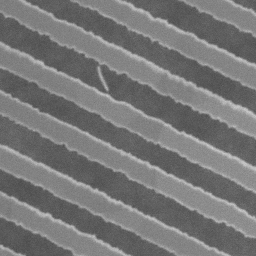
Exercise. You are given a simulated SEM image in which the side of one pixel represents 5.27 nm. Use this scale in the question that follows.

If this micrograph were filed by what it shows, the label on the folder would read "lines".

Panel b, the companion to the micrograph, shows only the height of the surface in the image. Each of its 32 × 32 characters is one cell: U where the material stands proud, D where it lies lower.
UUUUDDDDDDUUUUUUDDDDDDDUUUUUUUDD
UUUUUUDDDDDDUUUUUUDDDDDDDUUUUUUU
DDUUUUUUDDDDDDUUUUUUDDDDDDDUUUUU
DDDDUUUUUUDDDDDDUUUUUUDDDDDDDDUU
DDDDDDUUUUUUDDDDDDUUUUUUDDDDDDDD
DDDDDDDUUUUUUUDDDDDDUUUUUUDDDDDD
UUUDDDDDDDUUUUUUDDDDDDUUUUUUDDDD
UUUUDDDDDDDDUUUUUUDDDDDDUUUUUUDD
UUUUUUDDDDDDDDUUUUUUDDDDDDUUUUUU
DDUUUUUUUDDDDDDDUUUUUUDDDDDDUUUU
DDDDDUUUUUUDDDDDDDUUUUUUDDDDDDUU
DDDDDDUUUUUUDDDDDDDDUUUUUUDDDDDD
UUDDDDDDUUUUUUDDDDDDDDUUUUUUDDDD
UUUUDDDDDDUUUUUUUDDDDDDDUUUUUUDD
DUUUUUDDDDDDDUUUUUDDDDDDDDUUUUUU
DDUUUUUUDDDDDDUUUUUUUDDDDDDDUUUU
DDDDDUUUUUUDDDDDDUUUUUUDDDDDDDUU
DDDDDDUUUUUUDDDDDDUUUUUUUDDDDDDD
UDDDDDDDUUUUUUDDDDDDDUUUUUUDDDDD
UUUDDDDDDDDUUUUUUDDDDDDUUUUUUDDD
UUUUUDDDDDDDDUUUUUUDDDDDDUUUUUUD
DUUUUUUDDDDDDDDUUUUUUDDDDDDUUUUU
DDDUUUUUUDDDDDDDDUUUUUUDDDDDDUUU
DDDDDDUUUUUDDDDDDDDUUUUUUDDDDDDU
UDDDDDDUUUUUUDDDDDDDDUUUUUUDDDDD
UUUDDDDDDUUUUUUUDDDDDDDUUUUUUDDD
UUUUUDDDDDDUUUUUUDDDDDDDDUUUUUUD
DUUUUUUDDDDDDUUUUUUUDDDDDDDUUUUU
DDDUUUUUUDDDDDDUUUUUUUDDDDDDDUUU
DDDDDUUUUUUUDDDDDUUUUUUUDDDDDDDU
DDDDDDDUUUUUUDDDDDDUUUUUUUDDDDDD
UUDDDDDDDUUUUUUDDDDDDUUUUUUUDDDD